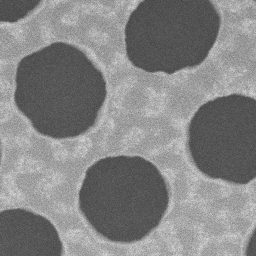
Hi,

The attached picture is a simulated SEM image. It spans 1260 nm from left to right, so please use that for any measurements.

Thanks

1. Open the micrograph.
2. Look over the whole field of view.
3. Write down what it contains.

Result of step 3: holes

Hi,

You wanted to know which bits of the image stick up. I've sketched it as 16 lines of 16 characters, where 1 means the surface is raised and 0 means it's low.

0011111100000011
1111111100000011
1111111100000111
1100001100000111
1000001110011111
1000000111111111
1000001111111000
1100001111110000
1110011111110000
1111111111110000
1111110000110000
1111100000011101
1111100000011111
0001100000111111
0000110000111111
0000111111111110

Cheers